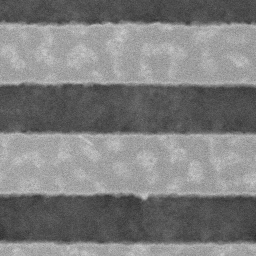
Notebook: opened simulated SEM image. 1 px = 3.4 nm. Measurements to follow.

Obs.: one or a few lines or trenches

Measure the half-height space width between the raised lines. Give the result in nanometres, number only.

165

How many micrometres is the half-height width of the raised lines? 0.209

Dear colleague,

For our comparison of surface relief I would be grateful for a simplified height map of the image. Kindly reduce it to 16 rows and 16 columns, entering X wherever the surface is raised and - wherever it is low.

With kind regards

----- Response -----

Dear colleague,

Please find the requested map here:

----------------
X---X-XXXX----XX
XXXXXXXXXXXXXXXX
XXXXXXXXXXXXXXXX
XXXXXXXXXXXXXXXX
----------------
----------------
----------------
XXXXXXXXXXXXXXXX
XXXXXXXXXXXXXXXX
XXXXXXXXXXXXXXXX
XXXXXXXXXXXXXXXX
----------------
----------------
----------------
XXXXXXXXXXXXXXXX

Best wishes